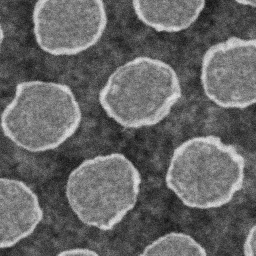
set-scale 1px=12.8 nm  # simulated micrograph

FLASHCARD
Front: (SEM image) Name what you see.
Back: raised bodies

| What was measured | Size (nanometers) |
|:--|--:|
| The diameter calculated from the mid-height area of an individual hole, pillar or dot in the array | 895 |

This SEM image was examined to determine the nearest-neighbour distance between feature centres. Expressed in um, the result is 1.27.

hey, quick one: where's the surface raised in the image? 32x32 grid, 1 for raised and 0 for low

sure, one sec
00000111111110000111111110000001
00000111111110000111111110000000
00000111111110000011111100000000
00001111111110000000111000000000
00000111111100000000000000000000
00000111111000000000000000000111
00000011100000000000000000011111
00000000000000000010000000111111
00000000000000011111100000111111
00000000000000111111110001111111
00011100000000111111110001111111
00111111100001111111110000111111
00111111100001111111100000011111
01111111110001111111100000000000
11111111110000111111000000000000
11111111100000011000000000000000
01111111100000000000000000000000
00111111000000000000000011000000
00011100000000000000000111110000
00000000000000100000001111111000
00000000001111110000011111111100
00000000011111111000011111111100
10000000011111111000011111111100
11100000111111111000001111111000
11110000111111111000001111111000
11111000011111111000000111100000
11111000011111110000000000000000
11111000001111000000000000000000
11110000000000000000000000000000
11100000000000000000011000000001
11000000000000000001111110000001
00000000011100000011111110000001